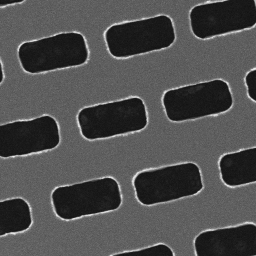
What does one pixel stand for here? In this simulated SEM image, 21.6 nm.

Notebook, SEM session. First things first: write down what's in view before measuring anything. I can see holes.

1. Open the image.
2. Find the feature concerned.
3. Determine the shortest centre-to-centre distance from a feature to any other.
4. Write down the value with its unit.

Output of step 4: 84.8 pixels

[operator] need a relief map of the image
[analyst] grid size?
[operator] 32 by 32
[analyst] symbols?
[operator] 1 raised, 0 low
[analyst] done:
01111111111111111111111111000000
11111111111111111111111100000000
11111111111111111100011100000000
11111111111111000000001100000001
11111110001110000000001110111111
11100000000110000000011111111111
11000000000111000011111111111111
11000000000111111111111111111111
11100000111111111111111111111111
11111111111111111111111111111110
11111111111111111111111110001110
11111111111111111111100000000110
11111111111111110011000000000111
11111111111000000011100000000111
11111111110000000011100000111111
10000001110000000011111111111111
00000001110000001111111111111111
00000001111111111111111111111111
00000001111111111111111111111111
00111111111111111111111111110000
11111111111111111111111011100000
11111111111111111100000001110000
11111111111100111000000001110000
11111110000000011000000001111111
11111110000000011000000011111111
00011110000000011101111111111111
00001110000001111111111111111111
00001111111111111111111111111111
00011111111111111111111111111000
11111111111111111111111110000000
11111111111111111111111100000000
11111111111111110000011110000000